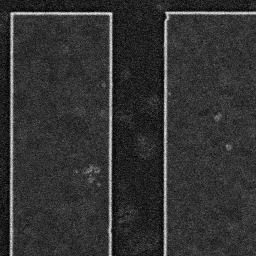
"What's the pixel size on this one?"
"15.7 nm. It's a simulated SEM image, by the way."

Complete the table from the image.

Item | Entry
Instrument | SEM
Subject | one or a few lines or trenches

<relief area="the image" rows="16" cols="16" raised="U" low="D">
DDDDDDDDDDDDDDDD
DUUUUUUDDDUUUUUU
DUUUUUUDDDUUUUUU
DUUUUUUDDDUUUUUU
DUUUUUUDDDUUUUUU
DUUUUUUDDDUUUUUU
DUUUUUUDDDUUUUUU
DUUUUUUDDDUUUUUU
DUUUUUUDDDUUUUUU
DUUUUUUDDDUUUUUU
DUUUUUUDDDUUUUUU
DUUUUUUDDDUUUUUU
DUUUUUUDDDUUUUUU
DUUUUUUDDDUUUUUU
DUUUUUUDDDUUUUUU
DUUUUUUDDDUUUUUU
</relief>